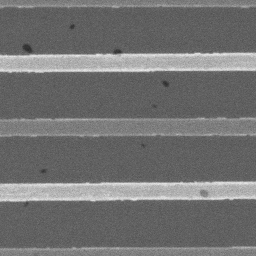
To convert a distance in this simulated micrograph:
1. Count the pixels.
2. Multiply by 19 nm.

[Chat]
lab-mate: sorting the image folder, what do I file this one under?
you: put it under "lines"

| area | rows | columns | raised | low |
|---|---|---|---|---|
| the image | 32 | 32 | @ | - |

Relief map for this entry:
@@@@@@@@@@@@@@@@@@@@@@@@@@@@@@@@
--------------------------------
--------------------------------
--------------------------------
--------------------------------
--------------------------------
--------------------------------
@@@@@@@@@@@@@@@@@@@@@@@@@@@@@@@@
@@@@@@@@@@@@@@@@@@@@@@@@@@@@@@@@
--------------------------------
--------------------------------
--------------------------------
--------------------------------
--------------------------------
--------------------------------
@@@@@@@@@@@@@@@@@@@@@@@@@@@@@@@@
@@@@@@@@@@@@@@@@@@@@@@@@@@@@@@@@
--------------------------------
--------------------------------
--------------------------------
--------------------------------
--------------------------------
--------------------------------
@@@@@@@@@@@@@@@@@@@@@@@@@@@@@@@@
@@@@@@@@@@@@@@@@@@@@@@@@@@@@@@@@
--------------------------------
--------------------------------
--------------------------------
--------------------------------
--------------------------------
--------------------------------
@@@@@@@@@@@@@@@@@@@@@@@@@@@@@@@@